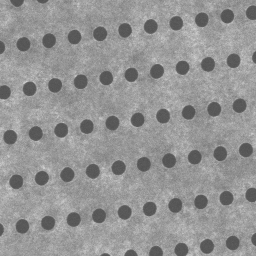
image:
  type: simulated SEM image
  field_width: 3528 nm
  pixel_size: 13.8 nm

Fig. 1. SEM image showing a regular array of holes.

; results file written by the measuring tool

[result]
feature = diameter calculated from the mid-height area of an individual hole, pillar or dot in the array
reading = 192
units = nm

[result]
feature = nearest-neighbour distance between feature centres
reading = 354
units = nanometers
